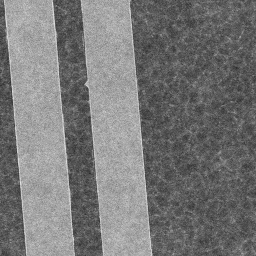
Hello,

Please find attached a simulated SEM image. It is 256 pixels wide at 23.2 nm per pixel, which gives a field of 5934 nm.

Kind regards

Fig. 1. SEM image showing one or a few lines or trenches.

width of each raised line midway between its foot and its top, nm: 1120